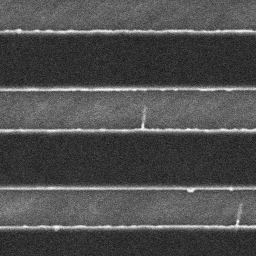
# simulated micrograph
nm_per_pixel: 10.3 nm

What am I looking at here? lines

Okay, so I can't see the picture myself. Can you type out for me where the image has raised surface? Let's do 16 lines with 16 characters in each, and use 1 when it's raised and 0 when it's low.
0000000000000000
0000000000000000
1111111111111111
1111111111111111
1111111111111111
1111111111111111
0000000000000000
0000000000000000
1111111111111111
1111111111111111
1111111111111111
1111111111111111
0000000000000000
0000000000000000
1111111111111111
1111111111111111